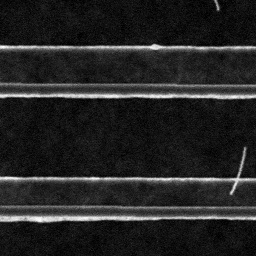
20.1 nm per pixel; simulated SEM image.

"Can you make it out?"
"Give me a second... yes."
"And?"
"lines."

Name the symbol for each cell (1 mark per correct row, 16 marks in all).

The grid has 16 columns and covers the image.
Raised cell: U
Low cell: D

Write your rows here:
DDDDDDDDDDDDDDDD
DDDDDDDDDDDDDDDD
DDDDDDDDDDDDDDDD
UUUUUUUUUUUUUUUU
UUUUUUUUUUUUUUUU
UUUUUUUUUUUUUUUU
DDDDDDDDDDDDDDDD
DDDDDDDDDDDDDDDD
DDDDDDDDDDDDDDDD
DDDDDDDDDDDDDDDD
DDDDDDDDDDDDDDDD
UUUUUUUUUUUUUUUU
UUUUUUUUUUUUUUUU
UUUUUUUUUUUUUUUU
DDDDDDDDDDDDDDDD
DDDDDDDDDDDDDDDD